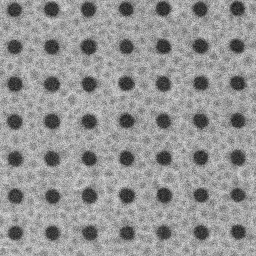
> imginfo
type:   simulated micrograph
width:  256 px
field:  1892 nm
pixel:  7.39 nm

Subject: a regular array of holes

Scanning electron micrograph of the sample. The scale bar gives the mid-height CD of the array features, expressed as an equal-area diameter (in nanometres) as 114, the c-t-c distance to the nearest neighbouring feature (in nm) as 272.